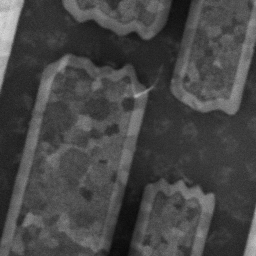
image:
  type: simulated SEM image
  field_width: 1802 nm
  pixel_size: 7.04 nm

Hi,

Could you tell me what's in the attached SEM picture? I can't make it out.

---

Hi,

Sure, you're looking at one or a few lines or trenches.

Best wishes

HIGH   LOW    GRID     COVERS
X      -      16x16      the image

X----XXXXX--XXXX
X------XXX--XXXX
------------XXXX
-----------XXXX-
---XXX-----XXXX-
---XXXXXX--XXXX-
---XXXXXX---XX--
--XXXXXXX-------
--XXXXXX--------
--XXXXXX--------
--XXXXXX--------
-XXXXXXX--------
-XXXXXX--XXXX---
-XXXXXX--XXXX---
-XXXXXX--XXXX---
XXXXXXX-XXXX----